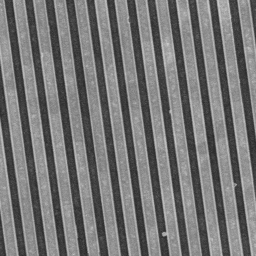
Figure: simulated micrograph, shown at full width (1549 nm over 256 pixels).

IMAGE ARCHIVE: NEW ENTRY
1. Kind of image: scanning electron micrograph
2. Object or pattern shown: parallel lines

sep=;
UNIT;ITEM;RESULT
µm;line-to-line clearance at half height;0.0548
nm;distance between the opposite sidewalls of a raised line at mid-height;65.3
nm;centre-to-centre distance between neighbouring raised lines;122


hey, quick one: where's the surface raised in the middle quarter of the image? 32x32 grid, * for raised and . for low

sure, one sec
**...***..***..***..***..***..**
***..***..***..***..***..***...*
***..***..***..***...**...**...*
***..***..***..***...**...**...*
***...**...**...**...**...**...*
.**...**...**...**...**...**...*
.**...**...**...**...***..***..*
.**...***..***..***..***..***..*
.***..***..***..***..***..***...
.***..***..***..***..***..***...
.***..***..***..***...**...**...
.***...**...**...**...**...**...
.***...**...**...**...**...**...
..**...**...**...**...***..***..
..**...***..***..**...***..***..
..**...***..***..***..***..***..
..***..***..***..***..***..***..
..***..***..***..***...**...**..
..***..***..***..***...**...**..
..***...**...**...**...**...**..
...**...**...**...**...***..***.
...**...**...**...**...***..***.
...**...***..***..***..***..***.
...***..***..***..***..***..***.
...***..***..***..***..***..***.
*..***..***..***..***...**...**.
*..***...**...**...**...**...**.
*..***...**...**...**...**...**.
*...**...**...**...**...***..***
*...**...***..***..***..***..***
*...**...***..***..***..***..***
*...***..***..***..***..***..***